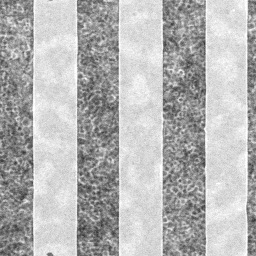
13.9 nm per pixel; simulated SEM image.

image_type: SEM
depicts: one or a few lines or trenches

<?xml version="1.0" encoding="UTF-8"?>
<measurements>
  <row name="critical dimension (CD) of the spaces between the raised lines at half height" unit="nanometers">602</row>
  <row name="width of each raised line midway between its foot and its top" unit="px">42.3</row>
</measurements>